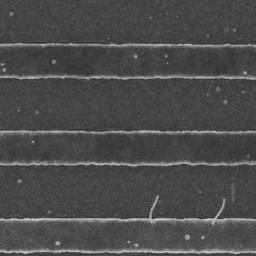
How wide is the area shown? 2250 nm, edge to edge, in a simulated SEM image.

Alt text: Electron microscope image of lines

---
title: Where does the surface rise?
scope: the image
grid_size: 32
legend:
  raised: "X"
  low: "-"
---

--------------------------------
--------------------------------
--------------------------------
--------------------------------
--------------------------------
------X-------------------------
XXXXXXXXXXXXXXXXXXXXXXXXXXXXXXXX
XXXXXXXXXXXXXXXXXXXXXXXXXXXXXXXX
XXXXXXXXXXXXXXXXXXXXXXXXXXXXXXXX
XXXXXXXXXXXXXXXXXXXXXXXXXXXXXXXX
--------------------------------
--------------------------------
--------------------------------
--------------------------------
--------------------------------
--------------------------------
XXXXXXXXXXX---XXXXXX--XXXXX----X
XXXXXXXXXXXXXXXXXXXXXXXXXXXXXXXX
XXXXXXXXXXXXXXXXXXXXXXXXXXXXXXXX
XXXXXXXXXXXXXXXXXXXXXXXXXXXXXXXX
XXXX-XXXXX--XXXXXXXXXX--XXXXXX--
--------------------------------
--------------------------------
--------------------------------
--------------------------------
--------------------------------
--------------------------------
XXXXXXXXXXXXXXXXXXXXXXXXXXXXXXXX
XXXXXXXXXXXXXXXXXXXXXXXXXXXXXXXX
XXXXXXXXXXXXXXXXXXXXXXXXXXXXXXXX
XXXXXXXXXXXXXXXXXXXXXXXXXXXXXXXX
XXXX---X--XXXXX----XXXXXXXXXXXX-